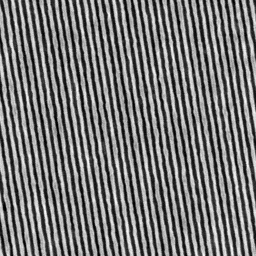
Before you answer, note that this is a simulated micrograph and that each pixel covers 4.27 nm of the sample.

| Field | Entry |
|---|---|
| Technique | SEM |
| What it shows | parallel lines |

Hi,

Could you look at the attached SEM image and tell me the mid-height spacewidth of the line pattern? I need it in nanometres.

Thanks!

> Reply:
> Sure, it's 18.5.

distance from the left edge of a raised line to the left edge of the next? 30.6 nm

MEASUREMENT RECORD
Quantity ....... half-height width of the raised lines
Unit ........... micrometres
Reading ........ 0.0116